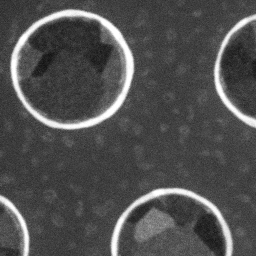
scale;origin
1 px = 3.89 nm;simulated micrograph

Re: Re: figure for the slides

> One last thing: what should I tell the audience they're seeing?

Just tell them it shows raised bodies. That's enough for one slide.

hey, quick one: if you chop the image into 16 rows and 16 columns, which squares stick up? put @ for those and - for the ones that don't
----------------
---@@@@--------@
-@@@@@@@------@@
-@@@@@@@------@@
-@@@@@@@------@@
-@@@@@@@------@@
--@@@@@-------@@
---@@@----------
----------------
----------------
----------------
----------------
---------@@@@---
@-------@@@@@@--
@@-----@@@@@@@--
@@-----@@@@@@@--